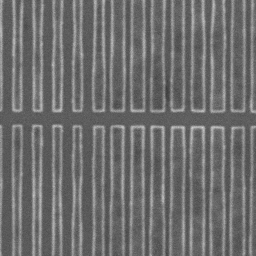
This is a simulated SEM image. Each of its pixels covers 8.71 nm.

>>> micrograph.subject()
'groups of lines, slits or small figures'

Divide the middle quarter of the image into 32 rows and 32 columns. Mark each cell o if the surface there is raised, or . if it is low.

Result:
..oo...ooo..ooo..ooo..ooo..ooo..
..oo...ooo..ooo..ooo..ooo..ooo..
..oo...ooo..ooo..ooo..ooo..ooo..
..oo...ooo..ooo..ooo..ooo..ooo..
..oo...ooo..ooo..ooo..ooo..ooo..
..oo...ooo..ooo..ooo..ooo..ooo..
..oo...ooo..ooo..ooo..ooo..ooo..
..oo...ooo..ooo..ooo..ooo..ooo..
..oo...ooo..ooo..ooo..ooo..ooo..
..oo...ooo..ooo..ooo..ooo..ooo..
..oo...ooo..ooo..ooo..ooo..ooo..
..oo...ooo..ooo..ooo..ooo..ooo..
................................
................................
................................
................................
..oo....oo..ooo..ooo..ooo..ooo..
..oo....oo..ooo..ooo..ooo..ooo..
...o....oo..ooo..ooo..ooo..ooo..
...o....oo..ooo..ooo..ooo..ooo..
..oo....oo..ooo..ooo..ooo..ooo..
..oo....oo..ooo..ooo..ooo..ooo..
..oo...ooo..ooo..ooo..ooo..ooo..
..oo...ooo..ooo..ooo..ooo..ooo..
..oo...ooo..ooo..ooo..ooo..ooo..
..oo...ooo..ooo..ooo..ooo..ooo..
..oo...ooo..ooo..ooo..ooo..ooo..
..oo...ooo..ooo..ooo..ooo..ooo..
..oo...ooo..ooo..ooo..ooo..ooo..
..oo...ooo..ooo..ooo..ooo..ooo..
...o...ooo..ooo..ooo..ooo..ooo..
...o...ooo..ooo..ooo..ooo..ooo..